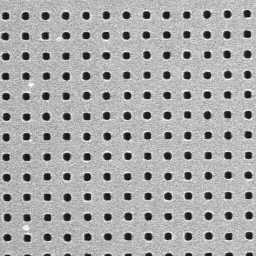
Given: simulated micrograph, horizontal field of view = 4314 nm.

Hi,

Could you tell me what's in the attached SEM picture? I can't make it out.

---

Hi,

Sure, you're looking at a regular array of holes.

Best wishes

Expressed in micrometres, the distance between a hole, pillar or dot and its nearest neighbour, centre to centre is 0.333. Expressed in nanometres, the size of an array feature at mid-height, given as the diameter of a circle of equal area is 145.